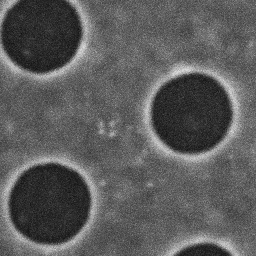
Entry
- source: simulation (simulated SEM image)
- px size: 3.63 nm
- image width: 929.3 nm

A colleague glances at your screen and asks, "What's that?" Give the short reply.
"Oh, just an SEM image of holes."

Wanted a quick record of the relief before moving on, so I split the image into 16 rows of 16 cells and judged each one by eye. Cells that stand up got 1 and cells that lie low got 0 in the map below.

1000011111111111
0000011111111111
0000011111111111
0000011111111111
1101111111111111
1111111111000011
1111111110000001
1111111110000001
1111111111000011
1111111111100111
1100111111111111
1000011111111111
1000001111111111
1000001111111111
1000011111111111
1111111111100011